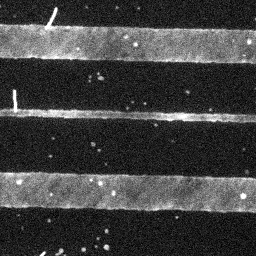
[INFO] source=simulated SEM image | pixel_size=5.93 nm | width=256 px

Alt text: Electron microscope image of lines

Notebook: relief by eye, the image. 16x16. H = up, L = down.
LLLLLLLLLLLLLLLL
LLLLLLLLLLLLLLLL
HHHHHHHHHHHHHHHH
HHHHLHHHHHHHHHHH
LLLLLLLLLLLLLLLL
LLLLLLLLLLLLLLLL
LLLLLLLLLLLLLLLL
LLLLLLLLLLLLLLLL
LLLLLLLLLLLLLLLL
LLLLLLLLLLLLLLLL
LLLLLLLLLLLLLLLL
HHHHHHHHHHHHHHHH
HHHHHHHHHHHHHHHH
LLLLLLLLLLLLLLLL
LLLLLLLLLLLLLLLL
LLLLLLLLLLLLLLLL